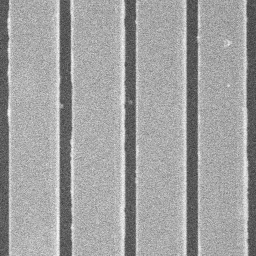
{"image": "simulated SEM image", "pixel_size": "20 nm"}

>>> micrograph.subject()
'lines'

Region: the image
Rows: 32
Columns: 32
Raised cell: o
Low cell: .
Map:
.oooooo..oooooo..oooooo..oooooo.
.oooooo..oooooo..oooooo..oooooo.
.oooooo..oooooo..oooooo..oooooo.
.oooooo..oooooo..oooooo..oooooo.
.oooooo..oooooo..oooooo..oooooo.
.oooooo..oooooo..oooooo..oooooo.
.oooooo..oooooo..oooooo..oooooo.
.oooooo..oooooo..oooooo..oooooo.
.oooooo..oooooo..oooooo..oooooo.
.oooooo..oooooo..oooooo..oooooo.
.oooooo..oooooo..oooooo..oooooo.
.oooooo..oooooo..oooooo..oooooo.
.oooooo..oooooo..oooooo..oooooo.
.oooooo..oooooo..oooooo..oooooo.
.oooooo..oooooo..oooooo..oooooo.
.oooooo..oooooo..oooooo..oooooo.
.oooooo..oooooo..oooooo..oooooo.
.oooooo..oooooo..oooooo..oooooo.
.oooooo..oooooo..oooooo..oooooo.
.oooooo..oooooo..oooooo..oooooo.
.oooooo..oooooo..oooooo..oooooo.
.oooooo..oooooo..oooooo..oooooo.
.oooooo..oooooo..oooooo..oooooo.
.oooooo..oooooo..oooooo..oooooo.
.oooooo..oooooo..oooooo..oooooo.
.oooooo..oooooo..oooooo..oooooo.
.oooooo..oooooo..oooooo..oooooo.
.oooooo..oooooo..oooooo..oooooo.
.oooooo..oooooo..oooooo..oooooo.
.oooooo..oooooo..oooooo..oooooo.
.oooooo..oooooo..oooooo..oooooo.
.oooooo..oooooo..oooooo..oooooo.